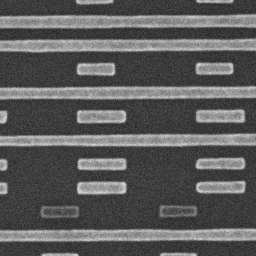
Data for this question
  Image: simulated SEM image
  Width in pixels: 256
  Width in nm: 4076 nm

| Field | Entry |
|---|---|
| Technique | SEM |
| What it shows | wiring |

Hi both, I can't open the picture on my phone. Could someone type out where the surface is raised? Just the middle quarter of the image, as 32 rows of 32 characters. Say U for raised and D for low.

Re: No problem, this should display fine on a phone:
DDDUUUUUUUUUUDDDDDDDDDDDDDDDDDDD
DDDUUUUUUUUUUDDDDDDDDDDDDDDDDDDD
DDDDDDDDDUUUDDDDDDDDDDDDDDDDDDDD
DDDDDDDDDDDDDDDDDDDDDDDDDDDDDDDD
DDDDDDDDDDDDDDDDDDDDDDDDDDDDDDDD
DDDDDDDDDDDDDDDDDDDDDDDDDDDDDDDD
UUUUUUUUUUUUUUUUUUUUUUUUUUUUUUUU
UUUUUUUUUUUUUUUUUUUUUUUUUUUUUUUU
UUUUUUUUUUUUUUUUUUUUUUUUUUUDDDDD
DDDDDDDDDDDDDDDDDDDDDDDDDDDDDDDD
DDDDDDDDDDDDDDDDDDDDDDDDDDDDDDDD
DDDDDDDDDDDDDDDDDDDDDDDDDDDDDDDD
DDDUUUUUUUUUUUUDDDDDDDDDDDDDDDDD
DDDUUUUUUUUUUUUDDDDDDDDDDDDDDDDD
DDDDUUUUUUUUUUUDDDDDDDDDDDDDDDDD
DDDDDDDDDDDDDDDDDDDDDDDDDDDDDDDD
DDDDDDDDDDDDDDDDDDDDDDDDDDDDDDDD
DDDDDDDDDDDDDDDDDDDDDDDDDDDDDDDD
UUUUUUUUUUUUUUUUUUUUUUUUUUUUUUUU
UUUUUUUUUUUUUUUUUUUUUUUUUUUUUUUU
DDDDDDDDDDDDDDDDDDDDDDDDDDDDDDDD
DDDDDDDDDDDDDDDDDDDDDDDDDDDDDDDD
DDDDDDDDDDDDDDDDDDDDDDDDDDDDDDDD
DDDDDDDDDDDDDDDDDDDDDDDDDDDDDDDD
DDDDUUUUUUUUUUUDDDDDDDDDDDDDDDDD
DDDDUUUUUUUUUUUDDDDDDDDDDDDDDDDD
DDDDDDDDDDDDDDDDDDDDDDDDDDDDDDDD
DDDDDDDDDDDDDDDDDDDDDDDDDDDDDDDD
DDDDDDDDDDDDDDDDDDDDDDDDDDDDDDDD
DDDDDDDDDDDDDDDDDDDDDDDDDDDDDDDD
DDDUUUUUUUUUUUUDDDDDDDDDDDDDDDDD
DDDUUUUUUUUUUUUDDDDDDDDDDDDDDDDD